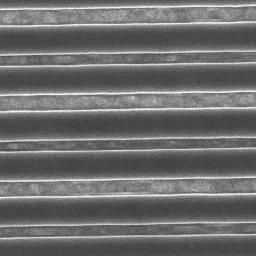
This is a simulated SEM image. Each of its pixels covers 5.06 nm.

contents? parallel lines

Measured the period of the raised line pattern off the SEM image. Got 217 nanometers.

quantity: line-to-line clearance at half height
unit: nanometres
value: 68.3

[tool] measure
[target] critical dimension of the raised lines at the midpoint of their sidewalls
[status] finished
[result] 150 nm